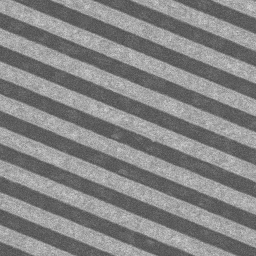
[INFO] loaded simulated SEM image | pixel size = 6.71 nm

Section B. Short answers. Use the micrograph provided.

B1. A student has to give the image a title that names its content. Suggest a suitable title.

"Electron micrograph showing parallel lines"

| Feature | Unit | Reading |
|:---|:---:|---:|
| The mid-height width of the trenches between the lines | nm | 103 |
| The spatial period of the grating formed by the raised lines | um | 0.203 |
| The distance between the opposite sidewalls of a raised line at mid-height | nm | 103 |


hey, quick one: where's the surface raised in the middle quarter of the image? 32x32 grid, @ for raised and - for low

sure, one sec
@@@@@@@----------@@@@@@@@@@-----
@@@@@@@@@-----------@@@@@@@@@@--
--@@@@@@@@@@----------@@@@@@@@@@
----@@@@@@@@@@-----------@@@@@@@
-------@@@@@@@@@@----------@@@@@
----------@@@@@@@@@-----------@@
@-----------@@@@@@@@@@----------
@@@@----------@@@@@@@@@@--------
@@@@@@@---------@@@@@@@@@@@-----
@@@@@@@@@----------@@@@@@@@@@---
-@@@@@@@@@@@---------@@@@@@@@@@-
----@@@@@@@@@@----------@@@@@@@@
------@@@@@@@@@@----------@@@@@@
---------@@@@@@@@@@----------@@@
@----------@@@@@@@@@@----------@
@@@-----------@@@@@@@@@@--------
@@@@@@----------@@@@@@@@@@------
@@@@@@@@-----------@@@@@@@@@@---
-@@@@@@@@@@----------@@@@@@@@@@-
---@@@@@@@@@@-----------@@@@@@@@
------@@@@@@@@@@----------@@@@@@
---------@@@@@@@@@----------@@@@
@----------@@@@@@@@@@----------@
@@@----------@@@@@@@@@@---------
@@@@@@----------@@@@@@@@@-------
@@@@@@@@----------@@@@@@@@@@----
@@@@@@@@@@@---------@@@@@@@@@@@-
---@@@@@@@@@@----------@@@@@@@@@
-----@@@@@@@@@@-----------@@@@@@
--------@@@@@@@@@@----------@@@@
----------@@@@@@@@@@----------@@
@@-----------@@@@@@@@@@---------